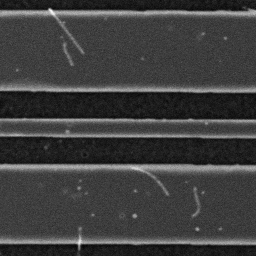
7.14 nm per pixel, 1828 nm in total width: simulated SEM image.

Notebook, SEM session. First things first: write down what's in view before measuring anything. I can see lines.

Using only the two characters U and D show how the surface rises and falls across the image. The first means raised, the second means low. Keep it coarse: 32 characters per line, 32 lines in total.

DDDDDDDDDDDDDDDDDDDDDDDDDDDDDDDD
UUUUUUUUUUUUUUUUUUUUUUUUUUUUUUUU
UUUUUUUUUUUUUUUUUUUUUUUUUUUUUUUU
UUUUUUUUUUUUUUUUUUUUUUUUUUUUUUUU
UUUUUUUUUUUUUUUUUUUUUUUUUUUUUUUU
UUUUUUUUUUUUUUUUUUUUUUUUUUUUUUUU
UUUUUUUUUUUUUUUUUUUUUUUUUUUUUUUU
UUUUUUUUUUUUUUUUUUUUUUUUUUUUUUUU
UUUUUUUUUUUUUUUUUUUUUUUUUUUUUUUU
UUUUUUUUUUUUUUUUUUUUUUUUUUUUUUUU
UUUUUUUUUUUUUUUUUUUUUUUUUUUUUUUU
DDDDDDDDDDDDDDDDDDDDDDDDUUUUUUUU
DDDDDDDDDDDDDDDDDDDDDDDDDDDDDDDD
DDDDDDDDDDDDDDDDDDDDDDDDDDDDDDDD
DDDDDDDDDDDDDDDDDDDDDDDDDDDDDDDD
UUUUUUUUUUUUUUUUUUUUUUUUUUUUUUUU
UUUUUUUUUUUUUUUUUUUUUUUUUUUUUUUU
DDDDDDDDDDDDDDDDDDDDDDDDDDDDDDDD
DDDDDDDDDDDDDDDDDDDDDDDDDDDDDDDD
DDDDDDDDDDDDDDDDDDDDDDDDDDDDDDDD
DDDDDDDDDDDDDDDDDDDDDDDDDDDDDDDD
UUUUUUUUUUUUUUUUUUUUUUUUUUUUUUUU
UUUUUUUUUUUUUUUUUUUUUUUUUUUUUUUU
UUUUUUUUUUUUUUUUUUUUUUUUUUUUUUUU
UUUUUUUUUUUUUUUUUUUUUUUUUUUUUUUU
UUUUUUUUUUUUUUUUUUUUUUUUUUUUUUUU
UUUUUUUUUUUUUUUUUUUUUUUUUUUUUUUU
UUUUUUUUUUUUUUUUUUUUUUUUUUUUUUUU
UUUUUUUUUUUUUUUUUUUUUUUUUUUUUUUU
UUUUUUUUUUUUUUUUUUUUUUUUUUUUUUUU
DDDDDDDDDUDDDDDDUUDDDDDDDUUUUUUU
DDDDDDDDDDDDDDDDDDDDDDDDDDDDDDDD